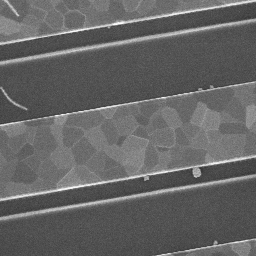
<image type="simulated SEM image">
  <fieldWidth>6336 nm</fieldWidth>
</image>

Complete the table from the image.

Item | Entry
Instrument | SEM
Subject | lines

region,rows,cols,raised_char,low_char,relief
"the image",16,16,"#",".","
#############...
########........
##..............
................
................
.............###
........########
..##############
################
################
############....
######..........
................
................
................
............####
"